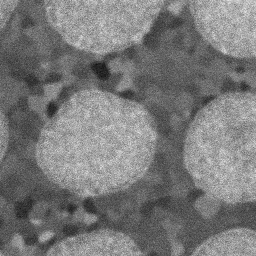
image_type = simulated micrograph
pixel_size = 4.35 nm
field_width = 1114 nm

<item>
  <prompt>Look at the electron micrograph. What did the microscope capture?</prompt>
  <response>holes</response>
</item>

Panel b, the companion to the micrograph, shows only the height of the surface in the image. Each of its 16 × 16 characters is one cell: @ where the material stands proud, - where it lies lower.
-@@-------@@----
@@@------@@@----
@@@@-----@@@@---
@@@@@@@@@@@@@@@-
@@@@@@@@@@@@@@@@
@@@@@@@@@@@@@@@@
@@@@----@@@@@---
@@@-------@@----
@@@-------@@----
@@--------@@----
@@@------@@@----
@@@@----@@@@----
@@@@@@@@@@@@@@-@
@@@@@@@@@@@@@@@@
@@@@@@-@@@@@@@--
@@@------@@@@---